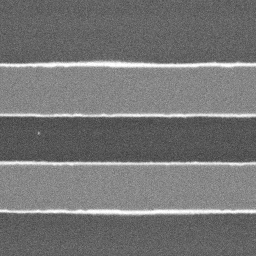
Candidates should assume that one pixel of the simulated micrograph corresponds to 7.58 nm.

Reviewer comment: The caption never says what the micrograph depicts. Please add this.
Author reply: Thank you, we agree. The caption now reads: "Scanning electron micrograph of lines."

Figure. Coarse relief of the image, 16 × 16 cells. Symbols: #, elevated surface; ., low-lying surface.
................
................
................
................
################
################
################
................
................
................
################
################
################
................
................
................